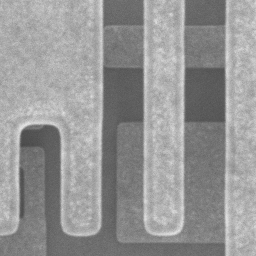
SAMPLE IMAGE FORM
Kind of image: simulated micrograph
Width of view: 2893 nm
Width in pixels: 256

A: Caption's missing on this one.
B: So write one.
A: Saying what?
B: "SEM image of wiring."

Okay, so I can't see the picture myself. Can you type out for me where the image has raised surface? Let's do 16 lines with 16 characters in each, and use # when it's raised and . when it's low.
######...###..##
######...###..##
######...##...##
######...###..##
######...###..##
######...##...##
######...##...##
######...##...##
#...##...##...##
#...##...##...##
#...##...##...##
#...##...##...##
#...##...##...##
#...##...##...##
#...##...##...##
..............##